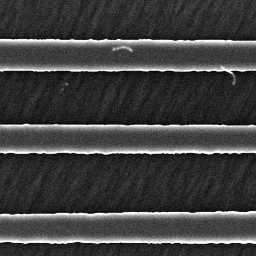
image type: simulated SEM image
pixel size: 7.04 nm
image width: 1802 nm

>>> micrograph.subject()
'lines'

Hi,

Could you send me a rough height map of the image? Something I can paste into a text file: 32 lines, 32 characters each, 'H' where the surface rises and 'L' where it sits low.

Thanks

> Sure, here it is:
LLLLLLLLLLLLLLLLLLLLLLLLLLLLLLLL
LLLLLLLLLLLLLLLLLLLLLLLLLLLLLLLL
LLLLLLLLLLLLLLLLLLLLLLLLLLLLLLLL
LLLLLLLLLLLLLLLLLLLLLLLLLLLLLLLL
LLLLLLLLLLLLLLLLLLLLLLLLLLLLLLLL
HHHHHHHHHHHHHHHHHHHHHHHHHHHHHHHH
HHHHHHHHHHHHHHHHHHHHHHHHHHHHHHHH
HHHHHHHHHHHHHHHHHHHHHHHHHHHHHHHH
HHHHHHHHHHHHHHHHHHHHHHHHHHHHHHHH
LLLLLLLLLLLLLLLLLLLLLLLLLLLLLLLL
LLLLLLLLLLLLLLLLLLLLLLLLLLLLLLLL
LLLLLLLLLLLLLLLLLLLLLLLLLLLLLLLL
LLLLLLLLLLLLLLLLLLLLLLLLLLLLLLLL
LLLLLLLLLLLLLLLLLLLLLLLLLLLLLLLL
LLLLLLLLLLLLLLLLLLLLLLLLLLLLLLLL
LLLLLLLLLLLLLLLLLLLLLLLLLLLLLLLL
HHHHHHHHHHHHHHHHHHHHHHHHHHHHHHHH
HHHHHHHHHHHHHHHHHHHHHHHHHHHHHHHH
HHHHHHHHHHHHHHHHHHHHHHHHHHHHHHHH
LLLLLLLLLLLLLLLLLLLLLLLLLLLLLLLL
LLLLLLLLLLLLLLLLLLLLLLLLLLLLLLLL
LLLLLLLLLLLLLLLLLLLLLLLLLLLLLLLL
LLLLLLLLLLLLLLLLLLLLLLLLLLLLLLLL
LLLLLLLLLLLLLLLLLLLLLLLLLLLLLLLL
LLLLLLLLLLLLLLLLLLLLLLLLLLLLLLLL
LLLLLLLLLLLLLLLLLLLLLLLLLLLLLLLL
LLLLLLLLLLLLLLLLLLLLLLLLLLLHHHLH
HHHHHHHHHHHHHHHHHHHHHHHHHHHHHHHH
HHHHHHHHHHHHHHHHHHHHHHHHHHHHHHHH
HHHHHHHHHHHHHHHHHHHHHHHHHHHHHHHH
LLLLLLLLLLLLLLLLLLLLLLLLLLLLLLLL
LLLLLLLLLLLLLLLLLLLLLLLLLLLLLLLL